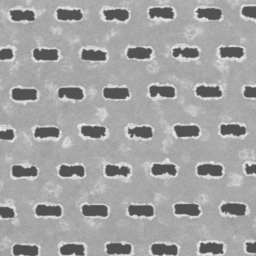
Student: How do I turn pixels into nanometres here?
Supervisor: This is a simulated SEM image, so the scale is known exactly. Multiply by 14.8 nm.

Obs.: a regular array of holes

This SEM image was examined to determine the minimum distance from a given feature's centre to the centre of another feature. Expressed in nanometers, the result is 664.